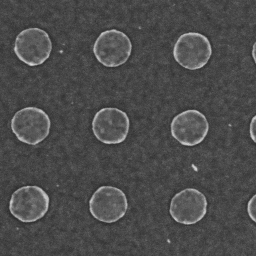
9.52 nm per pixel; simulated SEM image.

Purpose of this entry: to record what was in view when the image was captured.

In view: a regular array of raised bodies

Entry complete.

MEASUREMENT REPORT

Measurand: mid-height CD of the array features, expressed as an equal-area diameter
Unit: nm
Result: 345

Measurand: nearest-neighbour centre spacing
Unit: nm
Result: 750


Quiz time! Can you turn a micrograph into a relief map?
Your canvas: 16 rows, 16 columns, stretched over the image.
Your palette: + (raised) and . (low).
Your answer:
................
................
.++...++...++...
.++...++...++...
................
................
................
.++...++...++...
.++...++...++...
................
................
................
.++...++...++...
.++...++...++...
................
................